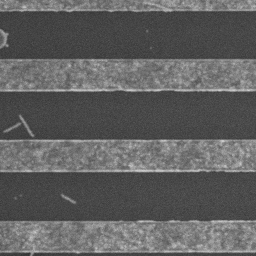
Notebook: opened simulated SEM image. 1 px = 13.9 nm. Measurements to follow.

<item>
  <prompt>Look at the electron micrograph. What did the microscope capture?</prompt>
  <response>lines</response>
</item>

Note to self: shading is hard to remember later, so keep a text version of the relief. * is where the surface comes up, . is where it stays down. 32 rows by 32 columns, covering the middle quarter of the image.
********************************
********************************
********************************
********************************
********************************
********************************
*************..*********....****
................................
................................
................................
................................
................................
................................
................................
................................
................................
................................
................................
................................
********************************
********************************
********************************
********************************
********************************
********************************
********************************
********************************
................................
................................
................................
................................
................................